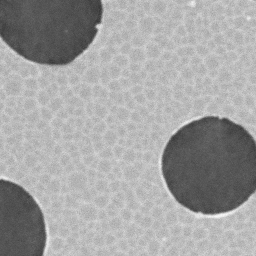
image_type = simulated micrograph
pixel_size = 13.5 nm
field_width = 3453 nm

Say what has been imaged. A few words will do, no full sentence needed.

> holes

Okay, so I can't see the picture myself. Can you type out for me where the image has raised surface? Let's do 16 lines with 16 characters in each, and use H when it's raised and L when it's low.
LLLLLLHHHHHHHHHH
LLLLLLHHHHHHHHHH
LLLLLLHHHHHHHHHH
HLLLLHHHHHHHHHHH
HHHHHHHHHHHHHHHH
HHHHHHHHHHHHHHHH
HHHHHHHHHHHHHHHH
HHHHHHHHHHHHLLHH
HHHHHHHHHHHLLLLL
HHHHHHHHHHLLLLLL
HHHHHHHHHHLLLLLL
LHHHHHHHHHLLLLLL
LLHHHHHHHHHLLLLH
LLLHHHHHHHHHHHHH
LLLHHHHHHHHHHHHH
LLLHHHHHHHHHHHHH